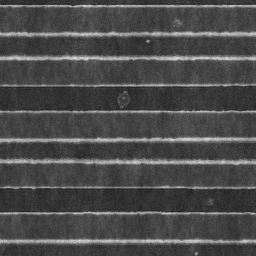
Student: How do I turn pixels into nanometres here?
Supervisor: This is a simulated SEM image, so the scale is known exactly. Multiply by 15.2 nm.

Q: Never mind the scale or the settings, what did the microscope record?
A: lines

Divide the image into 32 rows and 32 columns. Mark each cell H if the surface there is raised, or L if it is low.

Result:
LLLLLLLLLLLLLLLLLLLLLLLLLLLLLLLL
HHHHHHHHHHHHHHHHHHHHHHHHHHHHHHHH
HHHHHHHHHHHHHHHHHHHHHHHHHHHHHHHH
HHHHHHHHHHHHHHHHHHHHHHHHHHHHHHHH
LLLLLLLLLLLLLLLLLLLLLLLLLLLLLLLL
LLLLLLLLLLLLLLLLLLLLLLLLLLLLLLLL
LLLLLLLLLLLLLLLLLLLLLLLLLLLLLLLL
HHHHHHHHHHHHHHHHHHHHHHHHHHHHHHHH
HHHHHHHHHHHHHHHHHHHHHHHHHHHHHHHH
HHHHHHHHHHHHHHHHHHHHHHHHHHHHHHHH
HHHHHHHHHHHHHHHHHHHHHHHHHHHHHHHH
LLLLLLLLLLLLLLLLLLLLLLLLLLLLLLLL
LLLLLLLLLLLLLLLLLLLLLLLLLLLLLLLL
LLLLLLLLLLLLLLLLLLLLLLLLLLLLLLLL
HHHHHHHHHHHHHHHHHHHHHHHHHHHHHHHH
HHHHHHHHHHHHHHHHHHHHHHHHHHHHHHHH
HHHHHHHHHHHHHHHHHHHHHHHHHHHHHHHH
HHHHHHHHHHHHHHHHHHHLHHLLLLLLLLLL
LLLLLLLLLLLLLLLLLLLLLLLLLLLLLLLL
LLLLLLLLLLLLLLLLLLLLLLLLLLLLLLLL
HHHHHHHHHHHHHHHHHHHHHHHHHHHHHHHH
HHHHHHHHHHHHHHHHHHHHHHHHHHHHHHHH
HHHHHHHHHHHHHHHHHHHHHHHHHHHHHHHH
LLLLLLLLLLLLLLLLLLLLLLLLLLLLLLLL
LLLLLLLLLLLLLLLLLLLLLLLLLLLLLLLL
LLLLLLLLLLLLLLLLLLLLLLLLLLLLLLLL
LLLLLLLLLLLLLLLLLLLLLLLLLLLLLLLL
HHHHHHHHHHHHHHHHHHHHHHHHHHHHHHHH
HHHHHHHHHHHHHHHHHHHHHHHHHHHHHHHH
HHHHHHHHHHHHHHHHHHHHHHHHHHHHHHHH
LLLLLLLLLLLLLLLLLLLLLLLLLLLLLLLL
LLLLLLLLLLLLLLLLLLLLLLLLLLLLLLLL